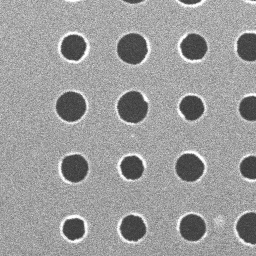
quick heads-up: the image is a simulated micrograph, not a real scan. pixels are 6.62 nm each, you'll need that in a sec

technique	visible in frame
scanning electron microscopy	a regular array of holes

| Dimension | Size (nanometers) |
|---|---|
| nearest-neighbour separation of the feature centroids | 390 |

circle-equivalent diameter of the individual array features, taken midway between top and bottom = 178 nm